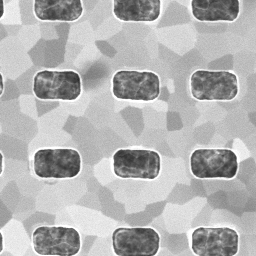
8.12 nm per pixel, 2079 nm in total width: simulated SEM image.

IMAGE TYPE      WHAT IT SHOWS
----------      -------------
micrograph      holes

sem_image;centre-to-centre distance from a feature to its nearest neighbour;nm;628